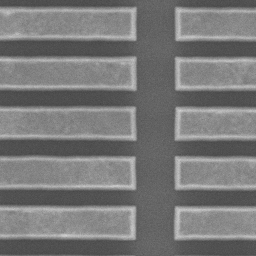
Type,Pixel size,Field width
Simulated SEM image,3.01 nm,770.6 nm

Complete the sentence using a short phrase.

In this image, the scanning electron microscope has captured groups of lines, slits or small figures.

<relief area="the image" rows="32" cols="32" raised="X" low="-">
--------------------------------
XXXXXXXXXXXXXXXXX-----XXXXXXXXXX
XXXXXXXXXXXXXXXXX-----XXXXXXXXXX
XXXXXXXXXXXXXXXXX-----XXXXXXXXXX
XXXXXXXXXXXXXXXXX-----XXXXXXXXXX
--------------------------------
--------------------------------
XXXXXXXXXXXXXXXXX-----XXXXXXXXXX
XXXXXXXXXXXXXXXXX-----XXXXXXXXXX
XXXXXXXXXXXXXXXXX-----XXXXXXXXXX
XXXXXXXXXXXXXXXXX-----XXXXXXXXXX
--------------------------------
--------------------------------
-XX-XX--XXXXXXX-----------------
XXXXXXXXXXXXXXXXX-----XXXXXXXXXX
XXXXXXXXXXXXXXXXX-----XXXXXXXXXX
XXXXXXXXXXXXXXXXX-----XXXXXXXXXX
--------------------------------
--------------------------------
--------------------------------
XXXXXXXXXXXXXXXXX-----XXXXXXXXXX
XXXXXXXXXXXXXXXXX-----XXXXXXXXXX
XXXXXXXXXXXXXXXXX-----XXXXXXXXXX
-----XXXXX-XXXXX------XX-XXXXXXX
--------------------------------
--------------------------------
XXXXXXXXXXXXXXXXX-----XXXXXXXXXX
XXXXXXXXXXXXXXXXX-----XXXXXXXXXX
XXXXXXXXXXXXXXXXX-----XXXXXXXXXX
XXXXXXXXXXXXXXXXX-----XXXXXXXXXX
--------------------------------
--------------------------------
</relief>